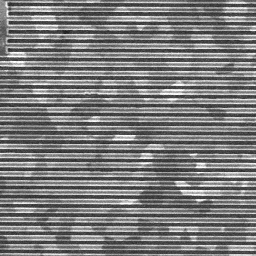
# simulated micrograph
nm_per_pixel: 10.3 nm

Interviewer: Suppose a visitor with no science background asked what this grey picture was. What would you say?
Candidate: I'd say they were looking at parallel lines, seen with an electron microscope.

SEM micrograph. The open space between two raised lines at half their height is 47.9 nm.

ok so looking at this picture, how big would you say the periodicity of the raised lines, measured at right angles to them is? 94.7 nm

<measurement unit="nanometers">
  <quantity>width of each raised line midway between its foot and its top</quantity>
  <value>46.6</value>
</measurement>